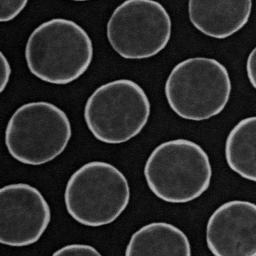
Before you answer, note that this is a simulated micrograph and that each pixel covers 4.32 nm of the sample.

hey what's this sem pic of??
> raised bodies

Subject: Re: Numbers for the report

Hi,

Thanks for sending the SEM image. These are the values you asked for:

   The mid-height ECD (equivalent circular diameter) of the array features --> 0.265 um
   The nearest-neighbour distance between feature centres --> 363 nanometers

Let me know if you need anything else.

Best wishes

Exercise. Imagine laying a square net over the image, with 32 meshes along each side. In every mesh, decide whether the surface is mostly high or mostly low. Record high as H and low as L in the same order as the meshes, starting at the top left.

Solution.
HHHLLLLLLLLLLLLHHHHHLLLLHHHHHHHL
HHLLLLLLLLLLLLHHHHHHHLLLHHHHHHHL
LLLLLLLLLLLLLLHHHHHHHLLLHHHHHHHL
LLLLLHHHHHLLLLHHHHHHHLLLLHHHHHLL
LLLLHHHHHHHLLLHHHHHHHLLLLLLHLLLL
LLLHHHHHHHHLLLHHHHHHHLLLLLLLLLLL
LLLHHHHHHHHLLLLHHHHHLLLLLLLLLLLL
HLLHHHHHHHHLLLLLLLLLLLLLHHLLLLLH
HLLLHHHHHHHLLLLLLLLLLLHHHHHHLLLH
HLLLLHHHHHLLLLLLLLLLLHHHHHHHLLLH
HLLLLLLLLLLLLLHHHLLLLHHHHHHHHLLL
LLLLLLLLLLLLHHHHHHLLLHHHHHHHHLLL
LLLLLLLLLLLHHHHHHHLLLHHHHHHHLLLL
LLLHHHHLLLLHHHHHHHLLLLHHHHHHLLLL
LLHHHHHHLLLHHHHHHHLLLLLHHHLLLLLL
LHHHHHHHHLLHHHHHHHLLLLLLLLLLLLHH
LHHHHHHHHLLLHHHHHLLLLLLLLLLLLHHH
LHHHHHHHLLLLLHHHLLLLLLLLLLLLLHHH
LHHHHHHHLLLLLLLLLLLLHHHHHLLLHHHH
LLHHHHHLLLLLLLLLLLLHHHHHHHLLHHHH
LLLLHLLLLLLLHLLLLLHHHHHHHHLLLHHH
LLLLLLLLLLHHHHHLLLHHHHHHHHLLLLHH
LLLLLLLLLHHHHHHHLLLHHHHHHHLLLLLL
LHHHLLLLLHHHHHHHLLLHHHHHHLLLLLLL
HHHHHLLLHHHHHHHHLLLLHHHHLLLLLLLL
HHHHHHLLHHHHHHHHLLLLLLLLLLLLLHHL
HHHHHHLLLHHHHHHLLLLLLLLLLLLHHHHH
HHHHHHLLLLHHHHLLLLLLLLLLLLHHHHHH
HHHHHLLLLLLLLLLLLLHHHHLLLLHHHHHH
HHHHHLLLLLLLLLLLLHHHHHHLLLHHHHHH
LHLLLLLLLLLLLLLLHHHHHHHHLLHHHHHH
LLLLLLLHHHHHLLLLHHHHHHHHLLLHHHHH